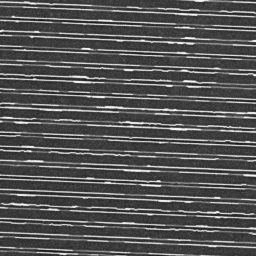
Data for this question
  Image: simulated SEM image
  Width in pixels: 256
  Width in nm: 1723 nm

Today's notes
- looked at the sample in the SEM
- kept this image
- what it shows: parallel lines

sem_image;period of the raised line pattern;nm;96.9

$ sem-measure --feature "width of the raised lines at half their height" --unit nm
76.6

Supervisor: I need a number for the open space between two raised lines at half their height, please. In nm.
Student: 23.6